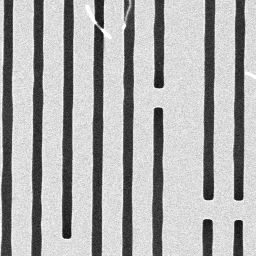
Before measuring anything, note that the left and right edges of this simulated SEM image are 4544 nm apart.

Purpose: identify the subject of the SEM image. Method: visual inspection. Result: groups of lines, slits or small figures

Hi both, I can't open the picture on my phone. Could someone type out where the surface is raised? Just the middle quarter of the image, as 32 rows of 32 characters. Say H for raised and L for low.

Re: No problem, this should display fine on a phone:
LLHHHHHLLLHHHHHLLHHHHHLLLHHHHHHH
LLHHHHHLLLHHHHHLLHHHHHLLLHHHHHHH
LLHHHHHLLLHHHHHLLHHHHHLLLHHHHHHH
LLHHHHHLLLHHHHHLLLHHHHLLLHHHHHHH
LLHHHHHLLLHHHHHLLLHHHHLLLHHHHHHH
LLHHHHHLLLHHHHHLLHHHHHLLLHHHHHHH
LLHHHHHLLLHHHHHLLHHHHHHHHHHHHHHH
LLHHHHHLLLHHHHHLLHHHHHHHHHHHHHHH
LLHHHHHLLLHHHHHLLHHHHHHHHHHHHHHH
LLHHHHHLLLHHHHHLLHHHHHHHHHHHHHHH
LLHHHHHLLLHHHHHLLLHHHHHHHHHHHHHH
LLHHHHHLLLHHHHHLLHHHHHLLLHHHHHHH
LLHHHHHLLLHHHHHLLHHHHHLLLHHHHHHH
LLHHHHHLLLHHHHHLLHHHHHLLLHHHHHHH
LLHHHHHLLLHHHHHLLHHHHHLLLHHHHHHH
LLHHHHHLLLHHHHHLLHHHHHLLLHHHHHHH
LLHHHHHLLLHHHHHLLHHHHHLLLHHHHHHH
LLHHHHHLLLHHHHHLLHHHHHLLLHHHHHHH
LLHHHHHLLLHHHHHLLHHHHHLLLHHHHHHH
LLHHHHHLLLHHHHHLLHHHHHLLLHHHHHHH
LLHHHHHLLLHHHHHLLHHHHHLLLHHHHHHH
LLHHHHHLLLHHHHHLLHHHHHLLLHHHHHHH
LLHHHHHLLLHHHHHLLHHHHHLLLHHHHHHH
LLHHHHHLLLHHHHLLLHHHHHLLLHHHHHHH
LLHHHHHLLLHHHHLLLHHHHHLLLHHHHHHH
LLHHHHHLLLHHHHHLLHHHHHLLLHHHHHHH
LLHHHHHLLLHHHHHLLHHHHHLLLHHHHHHH
LLHHHHHLLLHHHHHLLHHHHHLLLHHHHHHH
LLHHHHHLLLHHHHHLLHHHHHLLLHHHHHHH
LLHHHHHLLLHHHHHLLHHHHHLLLHHHHHHH
LLHHHHHLLLHHHHHLLHHHHHLLLHHHHHHH
LLHHHHHLLLHHHHHLLHHHHHLLLHHHHHHH